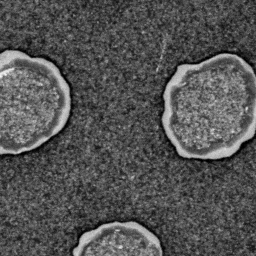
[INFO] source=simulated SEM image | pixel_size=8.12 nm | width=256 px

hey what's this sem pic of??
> raised bodies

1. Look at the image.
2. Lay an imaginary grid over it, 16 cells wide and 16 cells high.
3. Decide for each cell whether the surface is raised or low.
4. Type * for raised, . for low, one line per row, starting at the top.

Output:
................
................
................
.*............*.
****.......*****
****.......*****
****......******
****......******
***........****.
...........***..
................
................
................
................
......***.......
.....*****......